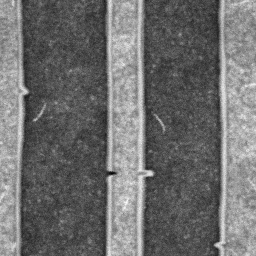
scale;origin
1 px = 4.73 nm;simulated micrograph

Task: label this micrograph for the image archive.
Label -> one or a few lines or trenches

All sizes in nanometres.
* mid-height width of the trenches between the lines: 401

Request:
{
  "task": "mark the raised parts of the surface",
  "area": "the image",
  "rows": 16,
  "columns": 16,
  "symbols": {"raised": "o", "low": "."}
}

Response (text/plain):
o......oo.....oo
o......oo.....oo
o......oo.....oo
o......oo.....oo
o......oo.....oo
o......oo.....oo
o......oo.....oo
o......oo.....oo
o......oo.....oo
o......oo.....oo
o......oo.....oo
o......oo.....oo
o......oo.....oo
o......oo.....oo
o......oo.....oo
o......oo.....oo